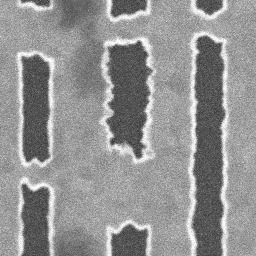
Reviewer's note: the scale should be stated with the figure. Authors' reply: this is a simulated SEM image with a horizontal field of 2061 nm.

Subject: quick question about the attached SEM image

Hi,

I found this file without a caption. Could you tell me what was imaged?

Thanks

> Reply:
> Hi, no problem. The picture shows one or a few lines or trenches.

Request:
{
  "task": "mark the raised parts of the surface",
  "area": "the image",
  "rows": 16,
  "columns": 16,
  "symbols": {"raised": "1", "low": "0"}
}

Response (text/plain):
1111111001110011
1111111111111111
1111111111110011
1101111001110011
1001111001110011
1001111001110011
1001111001110011
1001111001110011
1001111001110011
1001111101110011
1111111111110011
1111111111110011
1001111111110011
1001111111110011
1001111001110011
1001111001110011